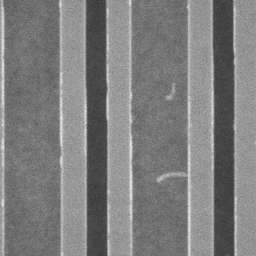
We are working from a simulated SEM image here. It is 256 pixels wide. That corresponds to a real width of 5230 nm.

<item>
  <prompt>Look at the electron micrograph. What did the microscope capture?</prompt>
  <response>lines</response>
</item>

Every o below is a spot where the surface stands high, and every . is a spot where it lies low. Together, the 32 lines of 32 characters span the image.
........ooo..ooo........ooo..ooo
........ooo..ooo........ooo..ooo
........ooo..ooo........ooo..ooo
........ooo..ooo........ooo..ooo
........ooo..ooo........ooo..ooo
........ooo..ooo........ooo..ooo
........ooo..ooo........ooo..ooo
........ooo..ooo........ooo..ooo
........ooo..ooo........ooo..ooo
........ooo..ooo........ooo..ooo
........ooo..ooo........ooo..ooo
........ooo..ooo........ooo..ooo
........ooo..ooo........ooo..ooo
........ooo..ooo........ooo..ooo
........ooo..ooo........ooo..ooo
........ooo...oo........ooo..ooo
........ooo...oo........ooo..ooo
........ooo..ooo........ooo..ooo
........ooo...oo........ooo..ooo
........ooo...oo........ooo..ooo
........ooo...oo........ooo..ooo
........ooo...oo........ooo..ooo
........ooo...oo........ooo..ooo
........ooo...oo........ooo..ooo
........ooo...oo........ooo..ooo
........ooo...oo........ooo..ooo
........ooo...oo........ooo..ooo
........ooo...oo........ooo..ooo
........ooo...oo........ooo..ooo
........ooo...oo........ooo..ooo
........ooo...oo........ooo..ooo
........ooo...oo........ooo..ooo